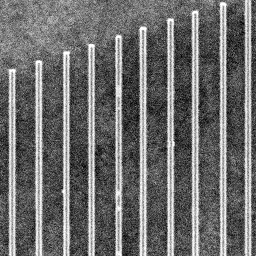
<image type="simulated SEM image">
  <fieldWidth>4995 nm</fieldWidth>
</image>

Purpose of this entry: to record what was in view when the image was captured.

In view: parallel lines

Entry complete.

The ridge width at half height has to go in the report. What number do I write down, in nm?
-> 90.2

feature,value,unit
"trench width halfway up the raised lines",446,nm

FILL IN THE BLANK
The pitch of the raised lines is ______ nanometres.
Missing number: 509